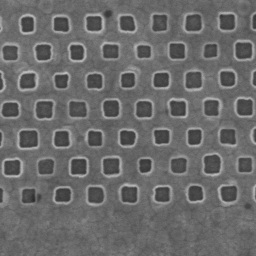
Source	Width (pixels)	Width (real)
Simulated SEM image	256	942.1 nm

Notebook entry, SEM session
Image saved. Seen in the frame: a regular array of holes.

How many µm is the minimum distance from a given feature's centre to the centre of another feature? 0.12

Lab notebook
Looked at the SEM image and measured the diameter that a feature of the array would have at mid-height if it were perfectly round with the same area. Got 61.6 nm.